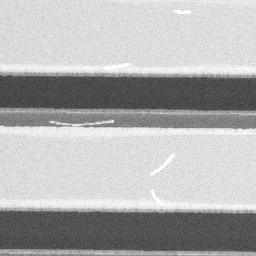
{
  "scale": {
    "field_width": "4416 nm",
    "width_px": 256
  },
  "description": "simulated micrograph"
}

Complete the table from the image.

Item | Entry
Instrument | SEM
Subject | lines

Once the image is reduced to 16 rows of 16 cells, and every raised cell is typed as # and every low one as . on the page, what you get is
################
################
################
################
################
................
................
################
################
################
################
################
################
................
................
................